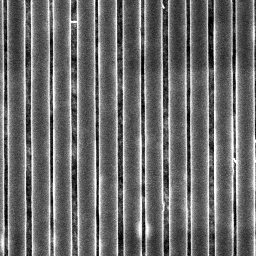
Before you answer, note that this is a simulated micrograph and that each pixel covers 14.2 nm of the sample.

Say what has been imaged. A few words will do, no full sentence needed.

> parallel lines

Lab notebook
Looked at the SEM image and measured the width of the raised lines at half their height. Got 256 nm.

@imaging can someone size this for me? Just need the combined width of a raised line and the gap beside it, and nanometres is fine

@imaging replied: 326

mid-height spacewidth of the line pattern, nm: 55.2